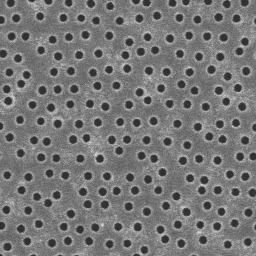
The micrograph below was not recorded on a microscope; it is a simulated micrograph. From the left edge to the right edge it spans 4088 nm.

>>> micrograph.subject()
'a regular array of holes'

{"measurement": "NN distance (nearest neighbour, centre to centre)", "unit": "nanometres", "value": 251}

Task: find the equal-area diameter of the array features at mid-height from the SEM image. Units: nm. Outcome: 137